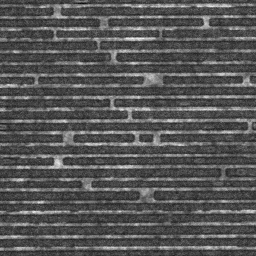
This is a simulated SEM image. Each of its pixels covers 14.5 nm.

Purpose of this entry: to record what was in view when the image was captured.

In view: parallel lines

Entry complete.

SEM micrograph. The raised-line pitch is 11.6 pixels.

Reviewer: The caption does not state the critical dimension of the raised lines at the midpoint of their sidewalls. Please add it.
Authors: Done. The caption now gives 36.3 nm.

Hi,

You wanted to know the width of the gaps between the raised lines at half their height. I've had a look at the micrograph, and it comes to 0.133 um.